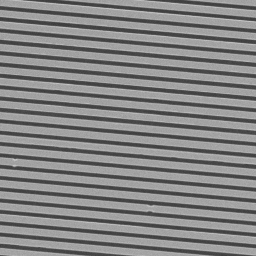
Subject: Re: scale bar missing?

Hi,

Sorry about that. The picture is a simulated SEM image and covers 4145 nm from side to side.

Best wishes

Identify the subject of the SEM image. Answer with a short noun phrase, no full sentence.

parallel lines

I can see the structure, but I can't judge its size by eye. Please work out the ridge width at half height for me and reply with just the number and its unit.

113 nm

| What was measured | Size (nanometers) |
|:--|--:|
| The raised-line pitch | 183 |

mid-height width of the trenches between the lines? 70.6 nanometres